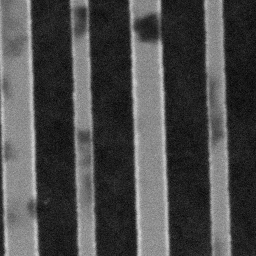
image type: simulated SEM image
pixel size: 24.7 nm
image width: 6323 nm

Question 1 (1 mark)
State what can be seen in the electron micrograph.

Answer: lines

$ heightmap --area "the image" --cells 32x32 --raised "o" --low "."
oooo.....oo.....oooo......oo....
oooo.....oo.....oooo......oo....
oooo.....oo.....oooo......oo....
oooo.....oo.....oooo......oo....
oooo.....oo......ooo......oo....
oooo.....oo......ooo......oo....
oooo.....oo......ooo......oo....
oooo.....oo......ooo......oo....
oooo.....oo......ooo......oo....
oooo.....oo......ooo......oo....
oooo.....oo......ooo......oo....
oooo.....oo......ooo......oo....
oooo.....oo......ooo......oo....
oooo.....oo......ooo......oo....
oooo.....oo......ooo......oo....
oooo.....oo......ooo......oo....
oooo.....oo......ooo......oo....
oooo.....ooo.....ooo......oo....
oooo.....ooo.....ooo......oo....
oooo......oo.....oooo.....oo....
oooo......oo.....oooo.....oo....
.ooo......oo.....oooo.....oo....
.ooo......oo.....oooo.....oo....
.ooo......oo.....oooo.....oo....
.ooo......oo.....oooo.....ooo...
.ooo......oo.....oooo.....ooo...
.ooo......oo.....oooo.....ooo...
.ooo......oo.....oooo.....ooo...
.ooo......oo.....oooo......oo...
.oooo.....oo.....oooo......oo...
.oooo.....oo.....oooo......oo...
.oooo.....oo.....oooo......oo...